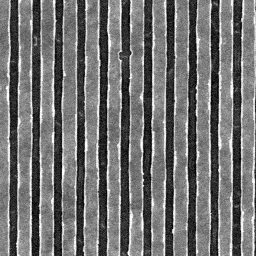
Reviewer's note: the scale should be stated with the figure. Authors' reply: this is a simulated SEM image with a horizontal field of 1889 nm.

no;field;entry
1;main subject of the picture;parallel lines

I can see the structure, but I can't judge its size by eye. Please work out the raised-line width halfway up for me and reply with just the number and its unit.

13.5 pixels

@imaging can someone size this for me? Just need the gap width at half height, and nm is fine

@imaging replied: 68.3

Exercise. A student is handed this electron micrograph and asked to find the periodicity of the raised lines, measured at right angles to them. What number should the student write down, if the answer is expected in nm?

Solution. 165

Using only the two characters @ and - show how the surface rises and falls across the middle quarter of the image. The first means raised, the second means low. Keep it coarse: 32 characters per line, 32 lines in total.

@@@---@@@--@@@---@@@--@@@---@@@-
@@@--@@@@--@@@---@@@--@@@---@@@-
@@@--@@@@--@@@---@@@--@@@---@@@-
@@@--@@@@--@@@---@@@--@@@---@@@-
@@@--@@@@--@@@---@@@--@@@---@@@-
@@@--@@@@--@@@--@@@@--@@@---@@@-
@@@--@@@@--@@@--@@@@--@@@---@@@-
@@@--@@@@--@@@---@@@--@@@---@@@-
@@@--@@@@--@@@---@@@--@@@---@@@-
@@@--@@@@--@@@---@@@--@@@---@@@-
@@@--@@@@--@@@---@@@--@@@---@@@-
@@@--@@@---@@@---@@@--@@@---@@@-
@@@--@@@---@@@---@@@--@@@---@@@-
@@@---@@---@@@---@@@--@@@---@@@-
@@@---@@---@@@---@@@--@@@---@@@-
@@@---@@---@@@---@@@--@@@---@@@-
@@@---@@---@@@---@@@--@@@---@@@-
@@@---@@---@@@---@@@--@@@---@@@-
@@@---@@---@@@---@@@--@@@---@@@-
@@@--@@@---@@@---@@---@@@---@@@-
@@@--@@@---@@@---@@---@@@---@@@-
@@@--@@@---@@@---@@@--@@@---@@@-
@@@--@@@---@@@---@@@--@@@---@@@-
@@@--@@@---@@@--@@@@--@@@---@@@-
@@@--@@@---@@@--@@@---@@@---@@@-
@@@--@@@---@@@--@@@---@@@---@@@-
@@@--@@@@--@@@--@@@---@@@---@@@-
@@@--@@@@--@@@--@@@@--@@@--@@@@-
@@@--@@@@--@@@--@@@@--@@@--@@@@-
@@@--@@@@--@@@--@@@@--@@@--@@@@-
@@@--@@@@--@@@--@@@@--@@@---@@@-
@@@--@@@---@@@--@@@@--@@@---@@@-